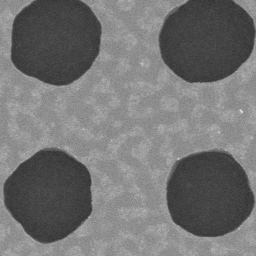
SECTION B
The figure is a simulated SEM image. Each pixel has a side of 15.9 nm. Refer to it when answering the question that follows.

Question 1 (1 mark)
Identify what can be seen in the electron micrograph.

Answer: holes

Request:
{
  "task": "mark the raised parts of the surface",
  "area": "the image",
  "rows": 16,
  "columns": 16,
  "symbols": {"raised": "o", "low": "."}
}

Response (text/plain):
oo....ooooo....o
o.....oooo......
o.....oooo......
o.....oooo......
o....oooooo....o
oooooooooooooooo
oooooooooooooooo
oooooooooooooooo
oooooooooooooooo
oo..ooooooooo.oo
o....oooooo....o
......oooo......
......oooo......
o.....ooooo.....
oo...ooooooo..oo
oooooooooooooooo